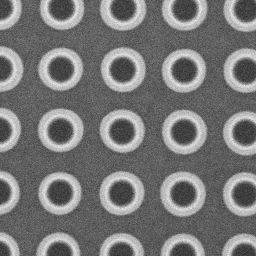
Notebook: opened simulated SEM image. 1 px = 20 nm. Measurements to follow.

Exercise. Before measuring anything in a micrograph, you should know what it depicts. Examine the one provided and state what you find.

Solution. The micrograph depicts an array of small figures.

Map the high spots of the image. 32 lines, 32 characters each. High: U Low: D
UUUDDUUUUUDDDUUUUUDDUUUUUUDDUUUU
UUUDDUUUUUDDDUUUUUDDUUUUUUDDUUUU
UUDDDUUUUUDDDUUUUUDDDUUUUDDDUUUU
UDDDDDDUUDDDDDUUUDDDDDUUDDDDDUUU
DDDDDDDDDDDDDDDDDDDDDDDDDDDDDDDD
DDDDDDDDDDDDDDDDDDDDDDDDDDDDDDDD
UUDDDDUUUDDDDDUUUDDDDDUUDDDDDUUU
UUUDDUUUUUDDDUUUUUDDDUUUUDDDUUUU
UUUDDUUUUUDDDUUUUUDDUUUUUUDDUUUU
UUUDDUUUUUDDDUUUUUDDUUUUUUDDUUUU
UUDDDDUUUDDDDUUUUDDDDUUUUDDDDUUU
DDDDDDDDDDDDDDDDDDDDDDDDDDDDDDUD
DDDDDDDDDDDDDDDDDDDDDDDDDDDDDDDD
DDDDDDDDDDDDDDDDDDDDDDDDDDDDDDDD
UUDDDUUUUUDDDUUUUDDDDUUUUDDDDUUU
UUDDDUUUUUDDDUUUUUDDUUUUUUDDUUUU
UUUDDUUUUUDDDUUUUUDDUUUUUUDDUUUU
UUDDDUUUUUDDDUUUUUDDDUUUUUDDUUUU
UDDDDDUUUDDDDDUUUDDDDUUUUDDDDUUU
DDDDDDDDDDDDDDDDDDDDDDDDDDDDDDDD
DDDDDDDDDDDDDDDDDDDDDDDDDDDDDDDD
UDDDDDDDDDDDDDDDDDDDDDDDDDDDDDDD
UUDDDUUUUUDDDUUUUDDDDUUUUDDDDUUU
UUDDDUUUUUDDDUUUUUDDUUUUUUDDUUUU
UUDDDUUUUUDDDUUUUUDDUUUUUUDDUUUU
UUDDDUUUUUDDDUUUUUDDUUUUUDDDUUUU
UDDDDDUUUDDDDDUUDDDDDUUUDDDDDUUU
DDDDDDDDDDDDDDDDDDDDDDDDDDDDDDDD
DDDDDDDDDDDDDDDDDDDDDDDDDDDDDDDD
UDDDDDUUUDDDDDUUDDDDDDUUDDDDDUUU
UUDDDUUUUUDDDUUUUUDDDUUUUDDDUUUU
UUDDDUUUUUDDDUUUUUDDUUUUUUDDUUUU